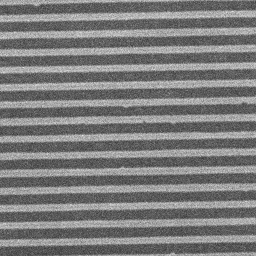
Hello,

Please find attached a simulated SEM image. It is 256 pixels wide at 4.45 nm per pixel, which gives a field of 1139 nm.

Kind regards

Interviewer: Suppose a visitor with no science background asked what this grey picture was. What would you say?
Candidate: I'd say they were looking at parallel lines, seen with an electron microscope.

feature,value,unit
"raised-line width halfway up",6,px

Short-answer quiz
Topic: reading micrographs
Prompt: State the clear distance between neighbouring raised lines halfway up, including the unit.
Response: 49.4 nm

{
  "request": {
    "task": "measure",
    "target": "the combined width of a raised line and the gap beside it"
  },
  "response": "76.8 nanometres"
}